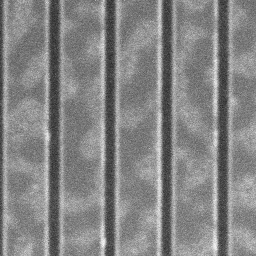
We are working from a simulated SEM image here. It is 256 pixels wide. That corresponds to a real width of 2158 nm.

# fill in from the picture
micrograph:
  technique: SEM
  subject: parallel lines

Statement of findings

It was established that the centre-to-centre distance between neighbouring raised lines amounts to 474 nm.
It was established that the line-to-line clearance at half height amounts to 0.103 microns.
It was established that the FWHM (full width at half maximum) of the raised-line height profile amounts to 0.37 microns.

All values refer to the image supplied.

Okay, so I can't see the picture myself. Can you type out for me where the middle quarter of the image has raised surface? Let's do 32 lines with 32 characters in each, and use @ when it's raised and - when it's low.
@@@@@@@@@@---@@@@@@@@@@@---@@@@@
@@@@@@@@@@---@@@@@@@@@@@---@@@@@
@@@@@@@@@@---@@@@@@@@@@@---@@@@@
@@@@@@@@@@---@@@@@@@@@@@---@@@@@
@@@@@@@@@@---@@@@@@@@@@@---@@@@@
@@@@@@@@@@---@@@@@@@@@@@---@@@@@
@@@@@@@@@@---@@@@@@@@@@@---@@@@@
@@@@@@@@@@---@@@@@@@@@@@---@@@@@
@@@@@@@@@@---@@@@@@@@@@@---@@@@@
@@@@@@@@@@---@@@@@@@@@@@---@@@@@
@@@@@@@@@@---@@@@@@@@@@@---@@@@@
@@@@@@@@@@---@@@@@@@@@@@---@@@@@
@@@@@@@@@@---@@@@@@@@@@@---@@@@@
@@@@@@@@@@---@@@@@@@@@@@---@@@@@
@@@@@@@@@@---@@@@@@@@@@@---@@@@@
@@@@@@@@@@---@@@@@@@@@@@---@@@@@
@@@@@@@@@@---@@@@@@@@@@@---@@@@@
@@@@@@@@@@---@@@@@@@@@@@---@@@@@
@@@@@@@@@@---@@@@@@@@@@@---@@@@@
@@@@@@@@@@---@@@@@@@@@@@---@@@@@
@@@@@@@@@@---@@@@@@@@@@@---@@@@@
@@@@@@@@@@---@@@@@@@@@@@---@@@@@
@@@@@@@@@@---@@@@@@@@@@@---@@@@@
@@@@@@@@@@---@@@@@@@@@@@---@@@@@
@@@@@@@@@@---@@@@@@@@@@@---@@@@@
@@@@@@@@@@---@@@@@@@@@@@---@@@@@
@@@@@@@@@@---@@@@@@@@@@@---@@@@@
@@@@@@@@@@---@@@@@@@@@@@---@@@@@
@@@@@@@@@@---@@@@@@@@@@@---@@@@@
@@@@@@@@@@---@@@@@@@@@@@---@@@@@
@@@@@@@@@@---@@@@@@@@@@@---@@@@@
@@@@@@@@@@---@@@@@@@@@@@---@@@@@